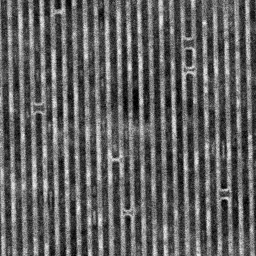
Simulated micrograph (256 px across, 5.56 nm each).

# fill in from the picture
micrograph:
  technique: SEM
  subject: parallel lines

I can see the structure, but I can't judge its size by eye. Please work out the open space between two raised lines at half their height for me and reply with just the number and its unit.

0.0403 micrometres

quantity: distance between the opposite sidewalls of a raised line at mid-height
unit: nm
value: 20.1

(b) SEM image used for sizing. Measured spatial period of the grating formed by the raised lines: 60.1 nm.